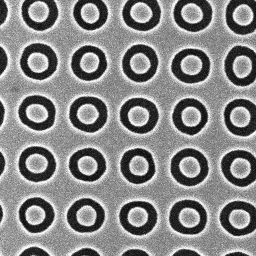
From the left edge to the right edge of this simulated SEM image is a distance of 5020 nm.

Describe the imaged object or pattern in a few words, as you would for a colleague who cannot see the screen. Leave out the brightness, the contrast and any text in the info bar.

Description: a regular array of ring-shaped grooves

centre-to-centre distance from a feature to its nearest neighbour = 0.975 microns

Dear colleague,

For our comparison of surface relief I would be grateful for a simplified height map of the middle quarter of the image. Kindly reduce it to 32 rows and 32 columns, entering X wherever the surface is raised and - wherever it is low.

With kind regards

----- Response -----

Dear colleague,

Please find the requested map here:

XX--XXXX---XXX---XXXX---XXX--XXX
XX---XXX---XXXX--XXXX--XXXX---XX
XXX-------XXXXX--------XXXX----X
XXX------XXXXXXX------XXXXXX----
XXXXXXXXXXXXXXXXX---XXXXXXXXX---
XXXXXXXXXXXXXXXXXXXXXXXXXXXXXXXX
XXXXXXXXXXXXXXXXXXXXXXXXXXXXXXXX
XXXXXXXXXXXXXXXXXXXXXXXXXXXXXXXX
XXX------XXXXXXXX---XXXXXXXXXXX-
XX--------XXXXX-------XXXXXXX---
XX---XX----XXX---------XXXXX----
X---XXXX---XXX--XXXX---XXXX---XX
X--XXXXXX--XXX--XXXXX---XXX---XX
X---XXXX---XXX--XXXXX---XXX---XX
XX---XX----XXX---XXXX--XXXX---XX
XX--------XXXXX---X----XXXXX---X
XXXX-----XXXXXXX------XXXXXX----
XXXXXXXXXXXXXXXXXX--XXXXXXXXXX--
XXXXXXXXXXXXXXXXXXXXXXXXXXXXXXXX
XXXXXXXXXXXXXXXXXXXXXXXXXXXXXXXX
XXXXXXXXXXXXXXXXXXXXXXXXXXXXXXXX
XXXX----XXXXXXXX-----XXXXXXXX---
XX--------XXXXX-------XXXXXX----
X----XX---XXXX---XXX--XXXXX---XX
X---XXXX--XXXX---XXXX--XXXX--XXX
X---XXXX---XXX--XXXXX--XXXX--XXX
X---XXXX---XXX---XXXX--XXX---XXX
XX---XX---XXXX----XX---XXXX---XX
XXX------XXXXXX-------XXXXX-----
XXXXX--XXXXXXXXX-----XXXXXXX----
XXXXXXXXXXXXXXXXXXXXXXXXXXXXXX--
XXXXXXXXXXXXXXXXXXXXXXXXXXXXXXXX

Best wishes